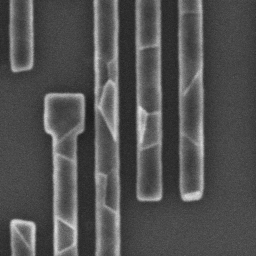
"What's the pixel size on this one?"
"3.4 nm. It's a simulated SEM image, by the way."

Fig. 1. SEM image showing wiring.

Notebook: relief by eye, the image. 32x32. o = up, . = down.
.ooo........ooo..ooo..ooo.......
.ooo........ooo..ooo..ooo.......
.ooo........ooo..ooo..ooo.......
.ooo........ooo..ooo..ooo.......
.ooo........ooo..ooo..ooo.......
.ooo........ooo..ooo..ooo.......
.ooo........ooo..ooo..ooo.......
.ooo........ooo..ooo..ooo.......
.ooo........ooo..ooo..ooo.......
............ooo..ooo..ooo.......
............ooo..ooo..ooo.......
............ooo..ooo..ooo.......
......oooo..ooo..ooo..ooo.......
......oooo..ooo..ooo..ooo.......
......oooo..ooo..ooo..ooo.......
......oooo..ooo..ooo...oo.......
......oooo..ooo..ooo...oo.......
.......ooo..ooo..ooo...oo.......
.......ooo..ooo..ooo..ooo.......
.......ooo..ooo..ooo..ooo.......
.......ooo..ooo..ooo...oo.......
.......ooo..ooo..ooo...oo.......
.......ooo..ooo..ooo...oo.......
.......ooo..ooo..ooo...oo.......
.......ooo..ooo..ooo...oo.......
.......ooo..ooo.................
.......ooo..ooo.................
.......ooo..ooo.................
.ooo...ooo..ooo.................
.ooo...ooo..ooo.................
.ooo...ooo..ooo.................
.ooo...ooo..ooo.................